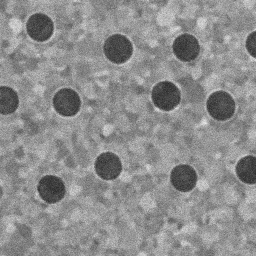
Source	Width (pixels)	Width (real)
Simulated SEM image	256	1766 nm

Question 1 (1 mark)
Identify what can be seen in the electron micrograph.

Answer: a regular array of holes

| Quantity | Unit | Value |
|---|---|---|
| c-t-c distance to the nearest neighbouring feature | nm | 423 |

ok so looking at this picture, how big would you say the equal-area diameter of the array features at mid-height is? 30 px